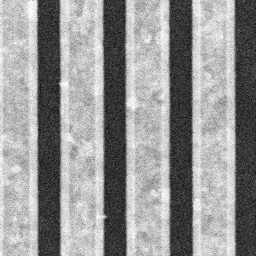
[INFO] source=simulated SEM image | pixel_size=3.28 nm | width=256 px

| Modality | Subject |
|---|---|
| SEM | one or a few lines or trenches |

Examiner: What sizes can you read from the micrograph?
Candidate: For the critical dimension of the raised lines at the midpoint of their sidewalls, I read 113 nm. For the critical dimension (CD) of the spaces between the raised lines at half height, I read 104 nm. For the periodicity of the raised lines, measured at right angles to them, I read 216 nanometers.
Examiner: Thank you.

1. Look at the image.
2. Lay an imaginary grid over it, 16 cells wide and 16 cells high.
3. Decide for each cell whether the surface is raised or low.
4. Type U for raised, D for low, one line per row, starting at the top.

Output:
UUDDUUDDUUDDUUDD
UUDDUUDDUUDDUUDD
UUDDUUDDUUDDUUDD
UUDDUUDDUUDDUUDD
UUDDUUDDUUDDUUDD
UUDDUUDDUUDDUUDD
UUDDUUDDUUDDUUDD
UUDDUUDDUUDDUUDD
UUDDUUDDUUDDUUDD
UUDDUUDDUUDDUUDD
UUDDUUDDUUDDUUDD
UUDDUUDDUUDDUUDD
UUDDUUDDUUDDUUDD
UUDDUUDDUUDDUUDD
UUDDUUDDUUDDUUDD
UUDDUUDDUUDDUUDD